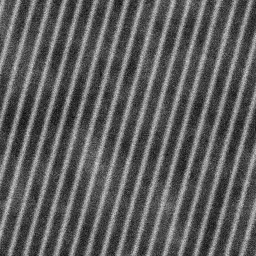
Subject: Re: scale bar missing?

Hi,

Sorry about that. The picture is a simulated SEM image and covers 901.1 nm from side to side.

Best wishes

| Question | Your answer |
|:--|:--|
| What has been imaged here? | parallel lines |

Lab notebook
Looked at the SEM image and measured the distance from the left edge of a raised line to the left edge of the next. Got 52.4 nanometers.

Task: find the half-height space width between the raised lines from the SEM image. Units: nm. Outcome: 41.1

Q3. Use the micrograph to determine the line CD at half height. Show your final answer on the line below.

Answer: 2.9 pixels